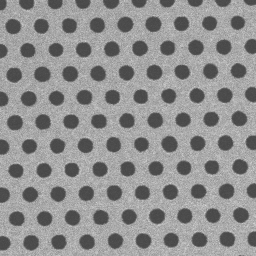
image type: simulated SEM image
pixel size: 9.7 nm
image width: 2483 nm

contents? a regular array of holes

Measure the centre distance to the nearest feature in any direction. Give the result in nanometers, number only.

267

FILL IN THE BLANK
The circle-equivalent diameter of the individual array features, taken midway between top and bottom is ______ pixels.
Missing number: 15.5